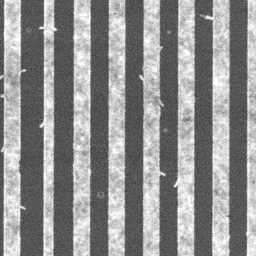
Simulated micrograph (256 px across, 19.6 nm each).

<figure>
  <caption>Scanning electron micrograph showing parallel lines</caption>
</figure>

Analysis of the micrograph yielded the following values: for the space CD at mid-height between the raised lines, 375 nm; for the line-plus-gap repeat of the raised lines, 682 nanometres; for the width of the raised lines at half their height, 307 nm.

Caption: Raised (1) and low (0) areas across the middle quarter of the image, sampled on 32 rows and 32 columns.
00011100000111100000111100000111
00011100000111100000111100000111
00011100000111100000111100000111
00011100000111100000111100000111
00011100000111100000111100000111
00011100000111100000111100000111
00011100000111100000111100000111
00011100000111100000111100000111
00011100000111100000111100000111
00011100000111100000111100000111
00011100000111100000111100000111
00011100000111100000111100000111
00011100000111100000111100000111
00011100000111100000111100000111
00011100000111100000111100000111
00011100000111100000111100000111
00011100000111100000111100000111
00011100000111100000111100000111
00011100000111100000111100000111
00011100000110100000111100000111
00011100000111100000111100000111
00011100000111100000111100000111
00011100000111100000111100000111
00011100000111100000111100000111
00011100000111100000111100000111
00011100000111100000111100000111
00111110000111100000111100000111
00111110000111100000111100000111
00011100000111100000111100000111
00011100000111100000111100001111
00011100000111100000111100001111
00011100000111100000111100000111